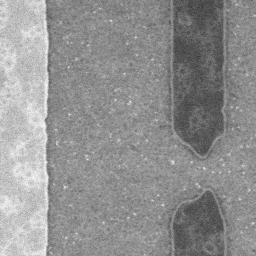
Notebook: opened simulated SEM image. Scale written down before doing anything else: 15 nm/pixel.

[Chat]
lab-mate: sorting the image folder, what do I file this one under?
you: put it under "one or a few lines or trenches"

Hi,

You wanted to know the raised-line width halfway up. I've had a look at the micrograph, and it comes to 782 nm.